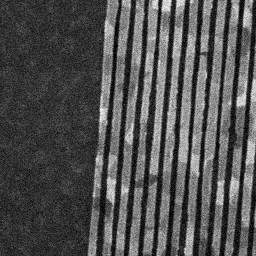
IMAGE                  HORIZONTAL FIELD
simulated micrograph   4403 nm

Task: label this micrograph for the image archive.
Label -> parallel lines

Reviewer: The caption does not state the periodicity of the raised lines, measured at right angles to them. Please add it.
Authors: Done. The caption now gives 234 nm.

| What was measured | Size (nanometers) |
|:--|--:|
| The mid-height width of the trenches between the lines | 114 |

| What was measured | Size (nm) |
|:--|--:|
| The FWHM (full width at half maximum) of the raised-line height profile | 131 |